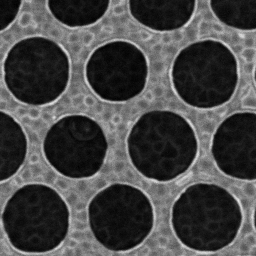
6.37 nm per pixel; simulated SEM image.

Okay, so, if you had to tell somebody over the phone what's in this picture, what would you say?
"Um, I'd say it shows a regular array of holes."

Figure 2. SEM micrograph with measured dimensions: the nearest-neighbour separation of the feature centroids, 82.7 pixels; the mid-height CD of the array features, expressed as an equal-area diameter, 430 nm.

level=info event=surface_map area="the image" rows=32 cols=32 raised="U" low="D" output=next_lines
DDDUUUDDDDDDDDUUDDDDDDDDUUDDDDDD
DDUUUUDDDDDDDUUUDDDDDDDDUUUDDDDD
DDUUUUUDDDDDUUUUUDDDDDDDUUUDDDDD
DUUUUUUUUUUUUUUUUUUDDDUUUUUUUDDD
UUUUUUUUUUUUUUUUUUUUUUUUUUUUUUUU
UUDDDDDUUUUUUDDDDUUUUUUUDDDDUUUU
UDDDDDDDUUUUDDDDDDUUUUUDDDDDDUUU
UDDDDDDDDUUDDDDDDDUUUUDDDDDDDDUU
DDDDDDDDDUUDDDDDDDUUUUDDDDDDDDUU
UDDDDDDDDUUDDDDDDDUUUUDDDDDDDDUU
UDDDDDDDUUUDDDDDDDUUUUDDDDDDDDUU
UDDDDDDDUUUUDDDDDDUUUUDDDDDDDUUU
UUDDDDDUUUUUUDDDUUUUUUUDDDDDDUUU
UUUUUUUUUUUUUUUUUUUUUUUUUDUUUUUU
DUUUUUUUDDDUUUUUUUDDDDDUUUUUUDDD
DDUUUUUDDDDDUUUUUDDDDDDDUUUUDDDD
DDDUUUDDDDDDDUUUDDDDDDDDUUUDDDDD
DDDUUUDDDDDDDUUUDDDDDDDDDUUDDDDD
DDDUUDDDDDDDDUUUDDDDDDDDDUDDDDDD
DDDUUUDDDDDDDUUUDDDDDDDDUUUDDDDD
DDDUUUDDDDDDDUUUUDDDDDDDUUUDDDDD
DDUUUUUDDDDDUUUUUDDDDDDUUUUUDDDD
UUUUUUUUUUUUUUUUUUUDDUUUUUUUUUUD
UUUDDDDUUUUUUDDDDUUUUUUDDDDDUUUU
UDDDDDDDUUUUDDDDDDUUUUDDDDDDDUUU
UDDDDDDDUUUDDDDDDDDUUUDDDDDDDDUU
DDDDDDDDDUUDDDDDDDDUUUDDDDDDDDUU
DDDDDDDDDUUDDDDDDDDUUDDDDDDDDDUU
DDDDDDDDDUUDDDDDDDDUUUDDDDDDDDUU
UDDDDDDDUUUUDDDDDDUUUUDDDDDDDUUU
UDDDDDDUUUUUUDDDDUUUUUUDDDDDDUUU
UUUDDDUUUUUUUUUUUUUUUUUUUUUUUUUU